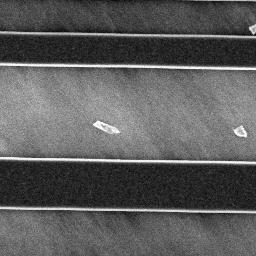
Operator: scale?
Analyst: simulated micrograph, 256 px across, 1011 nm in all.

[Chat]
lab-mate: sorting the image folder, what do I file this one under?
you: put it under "groups of lines, slits or small figures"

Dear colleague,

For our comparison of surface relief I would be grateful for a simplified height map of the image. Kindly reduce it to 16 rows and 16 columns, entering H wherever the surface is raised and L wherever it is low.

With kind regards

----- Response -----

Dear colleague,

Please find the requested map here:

LLLLLLLLLLLLLLLL
LLLLLLLLLLLLLLLL
HHHHHHHHHHHHHHHH
HHHHHHHHHHHHHHHH
LLLLLLLLLLLLLLLL
LLLLLLLLLLLLLLLL
LLLLLLLLLLLLLLLL
LLLLLLLLLLLLLLLL
LLLLLLLLLLLLLLLL
LLLLLLLLLLLLLLLL
HHHHHHHHHHHHHHHH
HHHHHHHHHHHHHHHH
HHHHHHHHHHHHHHHH
LLLLLLLLLLLLLLLL
LLLLLLLLLLLLLLLL
LLLLLLLLLLLLLLLL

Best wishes